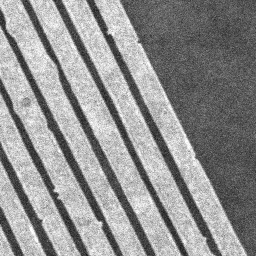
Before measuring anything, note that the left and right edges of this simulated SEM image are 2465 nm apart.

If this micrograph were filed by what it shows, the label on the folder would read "parallel lines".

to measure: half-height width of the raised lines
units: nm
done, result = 191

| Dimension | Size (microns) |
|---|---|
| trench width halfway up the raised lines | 0.0948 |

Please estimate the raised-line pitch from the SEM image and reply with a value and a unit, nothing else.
0.284 micrometres